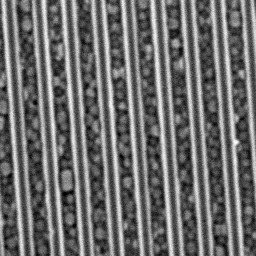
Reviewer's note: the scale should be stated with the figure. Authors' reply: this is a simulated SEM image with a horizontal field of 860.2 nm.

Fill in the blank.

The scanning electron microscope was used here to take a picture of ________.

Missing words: parallel lines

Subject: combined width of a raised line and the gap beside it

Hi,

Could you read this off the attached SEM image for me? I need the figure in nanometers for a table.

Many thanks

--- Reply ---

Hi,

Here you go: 100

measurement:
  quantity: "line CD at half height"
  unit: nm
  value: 39.7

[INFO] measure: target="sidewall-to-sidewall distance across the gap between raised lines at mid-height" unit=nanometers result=59.4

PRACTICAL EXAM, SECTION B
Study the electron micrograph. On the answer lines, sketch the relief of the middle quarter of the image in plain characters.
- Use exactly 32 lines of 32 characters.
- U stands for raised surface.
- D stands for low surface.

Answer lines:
DUUUDDDDUUUDDDDDUUUDDDDUUUDDDDDU
DUUUDDDDUUUDDDDDUUUDDDDUUUDDDDDU
DUUUDDDDUUUDDDDDUUUDDDDUUUDDDDDU
DUUUDDDDUUUDDDDDUUUDDDDUUUDDDDDU
DUUUDDDDDUUUDDDDUUUDDDDDUUUDDDDU
DUUUDDDDDUUUDDDDUUUDDDDDUUDDDDDU
DUUUDDDDDUUUDDDDUUUDDDDDUUUDDDDU
DUUUDDDDDUUUDDDDUUUDDDDDUUUDDDDU
DUUUDDDDDUUUDDDDUUUDDDDDUUUDDDDU
DDUUDDDDDUUUDDDDDUUDDDDDUUUDDDDU
DDUUDDDDDUUUDDDDDUUDDDDDUUUDDDDU
DDUUDDDDDUUUDDDDDUUDDDDDUUUDDDDU
DDUUUDDDDUUUDDDDDUUUDDDDUUUDDDDD
DDUUUDDDDUUUDDDDDUUUDDDDUUUDDDDD
DDUUUDDDDUUUDDDDDUUUDDDDUUUDDDDD
DDUUUDDDDUUUDDDDDUUUDDDDUUUDDDDD
DDUUUDDDDUUUDDDDDUUUDDDDUUUDDDDD
DDUUUDDDDDUUUDDDDUUUDDDDDUUDDDDD
DDUUUDDDDDUUUDDDDUUUDDDDDUUUDDDD
DDUUUDDDDDUUUDDDDUUUDDDDDUUUDDDD
DDUUUDDDDDUUUDDDDUUUDDDDDUUUDDDD
DDUUUDDDDDUUUDDDDUUUDDDDDUUUDDDD
DDDUUDDDDDUUUDDDDDUUDDDDDUUUDDDD
DDDUUDDDDDUUUDDDDDUUDDDDDUUUDDDD
DDDUUDDDDDUUUDDDDDUUDDDDDUUUDDDD
DDDUUUDDDDUUUDDDDDUUDDDDDUUUDDDD
DDDUUUDDDDUUUDDDDDUUUDDDDUUUDDDD
DDDUUUDDDDUUUDDDDDUUUDDDDUUUDDDD
UUDUUUDDDDUUUDDDDDUUUDDDDUUUDDDD
UUDUUUDDDDUUUDDDDDUUUDDDDUUUDDDD
DDDUUUDDDDDUUDDDDDUUUDDDDUUUDDDD
DDDUUUDDDDDUUUDDDDUUUDDDDDUUUDDD